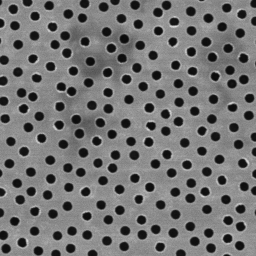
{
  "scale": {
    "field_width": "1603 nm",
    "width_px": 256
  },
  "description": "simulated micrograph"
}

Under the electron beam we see a regular array of holes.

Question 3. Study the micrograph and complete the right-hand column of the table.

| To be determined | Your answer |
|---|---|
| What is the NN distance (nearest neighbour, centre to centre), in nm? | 104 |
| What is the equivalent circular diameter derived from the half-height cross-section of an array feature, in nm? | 58.3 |